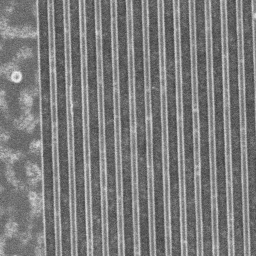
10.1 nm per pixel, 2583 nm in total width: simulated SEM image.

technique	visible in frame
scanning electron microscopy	parallel lines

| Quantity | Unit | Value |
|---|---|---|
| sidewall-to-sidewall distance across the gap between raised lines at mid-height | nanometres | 98.4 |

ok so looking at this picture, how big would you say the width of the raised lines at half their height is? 54.2 nm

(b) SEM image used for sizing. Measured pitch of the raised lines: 158 nm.